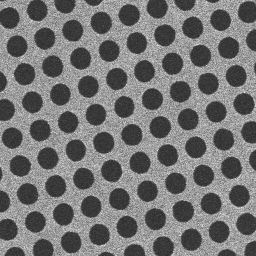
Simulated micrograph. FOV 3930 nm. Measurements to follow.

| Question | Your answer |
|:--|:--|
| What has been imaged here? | a regular array of holes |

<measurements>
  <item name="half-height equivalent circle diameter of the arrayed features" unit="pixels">21.8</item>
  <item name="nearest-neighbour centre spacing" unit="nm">443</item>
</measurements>